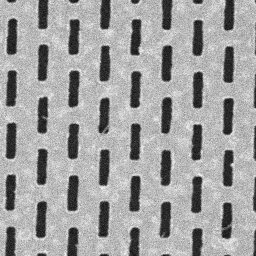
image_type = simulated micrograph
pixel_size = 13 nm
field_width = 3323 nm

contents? a regular array of holes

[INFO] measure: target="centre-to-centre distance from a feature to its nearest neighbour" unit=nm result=521